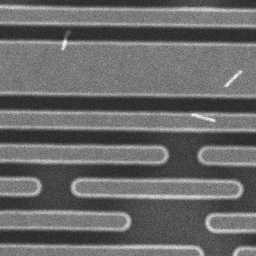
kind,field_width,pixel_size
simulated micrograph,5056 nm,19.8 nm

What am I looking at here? groups of lines, slits or small figures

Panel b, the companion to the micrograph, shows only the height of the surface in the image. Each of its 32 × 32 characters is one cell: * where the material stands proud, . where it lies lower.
................................
********************************
********************************
................................
................................
****************************....
********************************
********************************
********************************
********************************
********************************
********************************
................................
................................
********************************
********************************
................................
................................
********************......******
*********************....*******
..........................******
................................
*****.....*********.............
*****....*********************..
..........********************..
................................
***.............................
****************..........******
****************..........******
................................
................................
*************************.....**